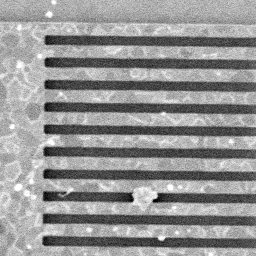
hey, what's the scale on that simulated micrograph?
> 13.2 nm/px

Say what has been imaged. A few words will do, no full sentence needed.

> groups of lines, slits or small figures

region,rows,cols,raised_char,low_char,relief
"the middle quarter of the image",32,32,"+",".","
................................
++++++++++++++++++++++++++++++++
++++++++++++++++++++++++++++++++
++++++++++++++++++++++++++++++++
................................
................................
................................
++++++++++++++++++++++++++++++++
++++++++++++++++++++++++++++++++
.......+++++++++++++++++++++++++
................................
................................
++++++++++++++++++++++++++++++++
++++++++++++++++++++++++++++++++
++++++++++++++++++++++++++++++++
................................
................................
................................
++++++++++++++++++++++++++++++++
++++++++++++++++++++++++++++++++
++++++++++++++++++++++++++++++++
................................
................................
+++++++.........................
++++++++++++++++++++++++++++++++
++++++++++++++++++++++++++++++++
.....................+++++++++++
................................
................................
++++++++++++++++++++++++++++++++
++++++++++++++++++++++++++++++++
++++++++++++++++++++++++++++++++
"